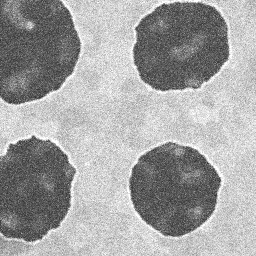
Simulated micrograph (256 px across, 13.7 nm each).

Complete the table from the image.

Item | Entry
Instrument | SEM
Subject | holes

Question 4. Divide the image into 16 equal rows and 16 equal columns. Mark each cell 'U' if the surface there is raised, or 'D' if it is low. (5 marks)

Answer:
DDDDUUUUUUDDDUUU
DDDDDUUUUDDDDDUU
DDDDDUUUDDDDDDUU
DDDDDUUUDDDDDDUU
DDDDDUUUUDDDDDUU
DDDDUUUUUUDDUUUU
UUUUUUUUUUUUUUUU
UUUUUUUUUUUUUUUU
UUUUUUUUUUUUUUUU
DDDDUUUUUDDDUUUU
DDDDDUUUDDDDDUUU
DDDDDUUUDDDDDDUU
DDDDUUUUDDDDDDUU
DDDDUUUUUDDDDUUU
DDDUUUUUUUDDUUUU
UUUUUUUUUUUUUUUU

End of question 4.